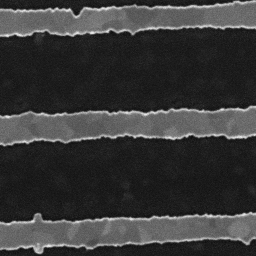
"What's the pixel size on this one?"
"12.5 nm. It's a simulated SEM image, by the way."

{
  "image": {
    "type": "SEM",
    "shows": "one or a few lines or trenches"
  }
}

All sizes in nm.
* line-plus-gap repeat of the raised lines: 1320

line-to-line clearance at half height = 1000 nm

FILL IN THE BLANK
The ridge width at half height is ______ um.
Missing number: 0.318